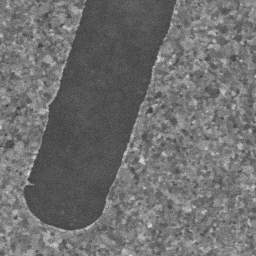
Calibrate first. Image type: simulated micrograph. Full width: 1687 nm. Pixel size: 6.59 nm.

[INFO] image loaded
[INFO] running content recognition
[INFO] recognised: one or a few lines or trenches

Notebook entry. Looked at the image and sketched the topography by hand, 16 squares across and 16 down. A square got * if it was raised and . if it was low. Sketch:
*****......*****
*****......*****
*****.....******
****......******
****......******
****.....*******
***......*******
***......*******
***.....********
**......********
**......********
**.....*********
**.....*********
**....**********
****************
******.*********